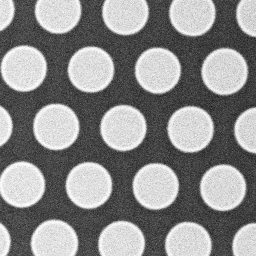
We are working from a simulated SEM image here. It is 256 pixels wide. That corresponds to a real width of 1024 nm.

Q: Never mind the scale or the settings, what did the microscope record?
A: an array of small figures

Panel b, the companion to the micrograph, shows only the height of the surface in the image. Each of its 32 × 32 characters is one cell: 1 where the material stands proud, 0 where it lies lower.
11000111110001111100011111100011
11001111110001111100011111100011
10000111110001111100011111100011
10000011100000111100001111000011
00000000000000000000000000000000
00000000000000000000000000000000
01111000001110000011100000011100
11111100011111000111110000111110
11111100011111000111110001111110
11111100011111000111110001111110
01111000011111000011110000111100
00000000000000000001100000011000
00000000000000000000000000000000
00000111100000111000000110000000
10000111100001111100001111000011
10001111110001111100011111100111
10001111110001111100011111100111
10000111100001111100011111000011
00000011000000111000001110000011
00000000000000000000000000000000
00110000001100000000000000000000
11111000011110000111110000111100
11111100111111000111110001111110
11111000111111000111110001111110
11111000011111000111110001111100
01110000011110000011100000111100
00000000000000000000000000000000
00000000000000000000000000000000
10000111100001111000001110000011
10001111110001111100011111000111
10001111110011111100011111000111
10001111100001111100011111000111